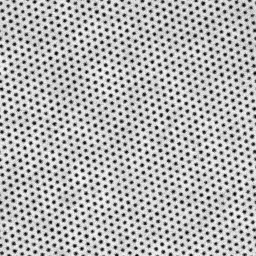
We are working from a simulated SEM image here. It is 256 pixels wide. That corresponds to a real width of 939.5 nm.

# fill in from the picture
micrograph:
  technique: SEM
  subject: a regular array of holes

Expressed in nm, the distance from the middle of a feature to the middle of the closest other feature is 27.4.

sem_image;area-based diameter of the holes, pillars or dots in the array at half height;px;3.9